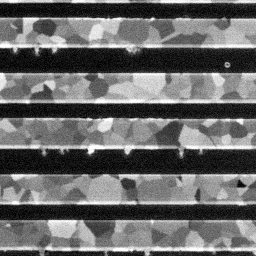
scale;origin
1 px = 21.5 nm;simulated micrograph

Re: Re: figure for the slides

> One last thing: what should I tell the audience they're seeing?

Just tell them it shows lines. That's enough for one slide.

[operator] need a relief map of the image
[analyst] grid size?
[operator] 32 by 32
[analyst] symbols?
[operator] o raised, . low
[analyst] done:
................................
................................
oooooooooooooooooooooooooooooooo
oooooooooooooooooooooooooooooooo
oooooooooooooooooooooooooooooooo
oooooooooooooooooooooooooooooooo
................................
................................
................................
oooooooooooooooooooooooooooooooo
oooooooooooooooooooooooooooooooo
oooooooooooooooooooooooooooooooo
oooooooooooooooooooooooooooooooo
................................
................................
oooooooooooooooooooooooooooooooo
oooooooooooooooooooooooooooooooo
oooooooooooooooooooooooooooooooo
.....o.....o...o......o.........
................................
................................
................................
oooooooooooooooooooooooooooooooo
oooooooooooooooooooooooooooooooo
oooooooooooooooooooooooooooooooo
................................
................................
................................
oooooooooooooooooooooooooooooooo
oooooooooooooooooooooooooooooooo
oooooooooooooooooooooooooooooooo
................................